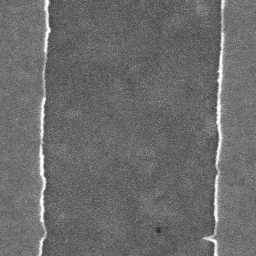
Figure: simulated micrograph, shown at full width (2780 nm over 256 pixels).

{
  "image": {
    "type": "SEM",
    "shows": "one or a few lines or trenches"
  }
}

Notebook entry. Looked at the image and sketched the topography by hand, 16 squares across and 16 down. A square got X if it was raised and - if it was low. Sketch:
XXX-----------XX
XXX-----------XX
XXX-----------XX
XXX-----------XX
XXX-----------XX
XXX-----------XX
XXX-----------XX
XXX----------XXX
XXX----------XXX
XXX-----------XX
XXX-----------XX
XXX----------XXX
XXX----------XXX
XXX----------XXX
XXX----------XXX
XXX----------XXX